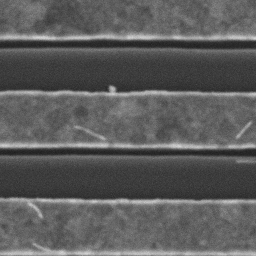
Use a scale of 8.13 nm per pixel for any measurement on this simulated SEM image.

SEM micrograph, lines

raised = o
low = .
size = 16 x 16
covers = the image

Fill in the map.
oooooooooooooooo
oooooooooooooooo
................
................
................
................
oooooooooooooooo
oooooooooooooooo
oooooooooooooooo
................
................
................
ooooo...........
oooooooooooooooo
oooooooooooooooo
oooooooooooooooo